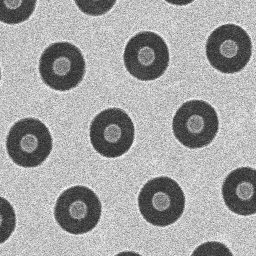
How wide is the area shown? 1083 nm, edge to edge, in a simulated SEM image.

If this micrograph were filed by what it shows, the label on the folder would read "a regular array of ring-shaped grooves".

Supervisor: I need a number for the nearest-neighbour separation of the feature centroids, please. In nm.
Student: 351